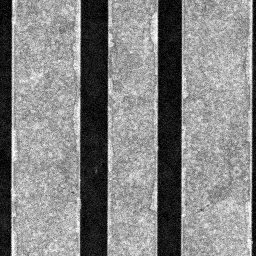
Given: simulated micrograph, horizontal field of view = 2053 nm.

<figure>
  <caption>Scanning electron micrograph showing one or a few lines or trenches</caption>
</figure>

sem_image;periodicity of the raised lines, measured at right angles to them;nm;684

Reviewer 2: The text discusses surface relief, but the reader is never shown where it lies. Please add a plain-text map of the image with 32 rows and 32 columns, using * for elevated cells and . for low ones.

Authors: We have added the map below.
..********....******...********.
..********....******...********.
..********....******...********.
..********....******...********.
..********....******...********.
..********....******...********.
..********....******...********.
..********....******...********.
..********....******...********.
..********....******...********.
..********....******...********.
..********....******...********.
..********....******...********.
..********....******...********.
..********....******...********.
..********....******...********.
..********....******...********.
..********....******...********.
..********....******...********.
..********....******...********.
..********....******...********.
..********....******...********.
..********....******...********.
.*********....******...********.
.*********....******...********.
..********....******...********.
..********....******...********.
..********....******...********.
..********....******...********.
..********....*****....********.
..********....*****....********.
..********....*****....********.